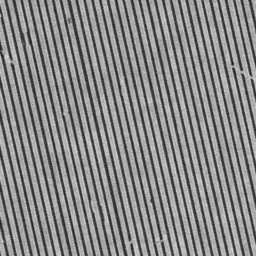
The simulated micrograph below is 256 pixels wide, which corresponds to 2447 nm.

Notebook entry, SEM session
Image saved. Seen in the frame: parallel lines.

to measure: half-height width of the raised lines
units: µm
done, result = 0.0431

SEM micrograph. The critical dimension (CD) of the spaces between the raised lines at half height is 2.8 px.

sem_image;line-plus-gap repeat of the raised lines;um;0.0734